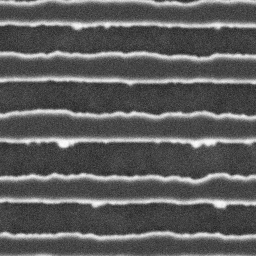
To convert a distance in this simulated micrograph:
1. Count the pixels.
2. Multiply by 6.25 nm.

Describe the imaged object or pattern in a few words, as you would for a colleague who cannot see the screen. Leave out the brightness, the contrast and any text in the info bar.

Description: lines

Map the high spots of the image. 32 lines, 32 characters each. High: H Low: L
HHHHHHHHHHHHHHHHHHHHHHHHHHHHHHHH
HHHHHHHHHHHHHHHHHHHHHHHHHHHHHHHH
HHHHHHHHHHHHHHHHHHHHHHHHHHHHHHHH
LLLLLLLLLLLLLLLLLLLLLLLLLLLLLLLL
LLLLLLLLLLLLLLLLLLLLLLLLLLLLLLLL
LLLLLLLLLLLLLLLLLLLLLLLLLLLLLLLL
LLLLLLLHLLLLLLLLLLLLLLLLLLLLLLLL
HHHHHHHHHHHHHHHHHHHHHHHHHHHHHHHH
HHHHHHHHHHHHHHHHHHHHHHHHHHHHHHHH
HHHHHHHHHHHHHHHHHHHHHHHHHHHHHHHH
LLLLLLLLLLLLLLLLLLLLLLLLLLLLLLLL
LLLLLLLLLLLLLLLLLLLLLLLLLLLLLLLL
LLLLLLLLLLLLLLLLLLLLLLLLLLLLLLLL
LLLLLLLLLLLLLLLLLLLLLLLLLLLLLLLL
HHHHHHHHHHHHHHHHHHHHHHHHHHHHHHHL
HHHHHHHHHHHHHHHHHHHHHHHHHHHHHHHH
HHHHHHHHHHHHHHHHHHHHHHHHHHHHHHHH
HHHHHHHHHHHHHHHHHHHHHHHHHHHHHHHH
LLLLLLLLLLLLLLLLLLLLLLLLLLLLLLLL
LLLLLLLLLLLLLLLLLLLLLLLLLLLLLLLL
LLLLLLLLLLLLLLLLLLLLLLLLLLLLLLLL
LLLLLLLLLLLLLLLLLLLLLLLLLLLLLLLL
HHHHHHHHHHHHHHHHHHHHHHHHHHHHHHHH
HHHHHHHHHHHHHHHHHHHHHHHHHHHHHHHH
HHHHHHHHHHHHHHHHHHHHHHHHHHHHHHHH
LLLLLLLLLLLLLLLLLLLLLLLLLLLLLLHH
LLLLLLLLLLLLLLLLLLLLLLLLLLLLLLLL
LLLLLLLLLLLLLLLLLLLLLLLLLLLLLLLL
LLLLLLLLLLLLLLLLLLLLLLLLLLLLLLLL
HHHHHHHHHHHHLLHHHHHHHHHHHHHHHHHH
HHHHHHHHHHHHHHHHHHHHHHHHHHHHHHHH
HHHHHHHHHHHHHHHHHHHHHHHHHHHHHHHH